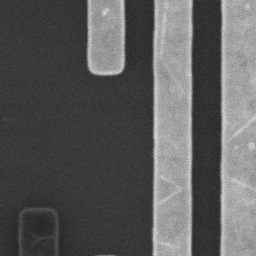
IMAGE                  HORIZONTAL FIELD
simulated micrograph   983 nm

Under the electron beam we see wiring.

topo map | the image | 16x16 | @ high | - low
------@@--@@--@@
------@@--@@--@@
------@@--@@--@@
------@@--@@--@@
------@---@@--@@
----------@@--@@
----------@@--@@
----------@@--@@
----------@@--@@
----------@@--@@
----------@@--@@
----------@@--@@
----------@@--@@
-@@-------@@--@@
-@@@------@@--@@
-@@@------@@--@@